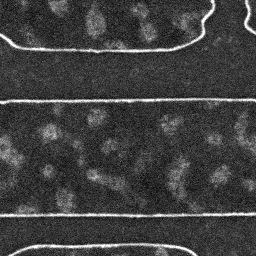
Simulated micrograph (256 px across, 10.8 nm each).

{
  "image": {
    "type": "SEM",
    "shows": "one or a few lines or trenches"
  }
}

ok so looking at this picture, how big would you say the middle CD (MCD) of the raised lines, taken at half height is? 1.25 microns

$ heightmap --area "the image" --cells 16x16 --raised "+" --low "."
+++++++++++++..+
+++++++++++++..+
++++++++++++....
................
................
................
++++++++++++++++
++++++++++++++++
++++++++++++++++
++++++++++++++++
++++++++++++++++
++++++++++++++++
++++++++++++++++
....+...+.......
................
..+++++++++.....